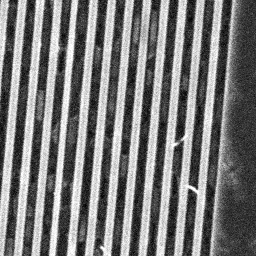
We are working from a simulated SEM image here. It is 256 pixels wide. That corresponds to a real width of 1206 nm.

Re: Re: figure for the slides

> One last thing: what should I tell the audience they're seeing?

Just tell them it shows parallel lines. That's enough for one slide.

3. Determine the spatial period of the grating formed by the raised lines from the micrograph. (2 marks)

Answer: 83.6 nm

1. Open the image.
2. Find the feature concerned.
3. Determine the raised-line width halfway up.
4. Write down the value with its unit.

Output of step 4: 0.0346 um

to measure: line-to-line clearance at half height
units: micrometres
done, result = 0.0481